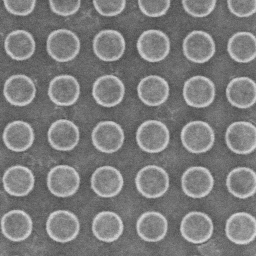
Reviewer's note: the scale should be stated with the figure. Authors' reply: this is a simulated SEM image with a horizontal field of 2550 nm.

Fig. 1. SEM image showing a regular array of raised bodies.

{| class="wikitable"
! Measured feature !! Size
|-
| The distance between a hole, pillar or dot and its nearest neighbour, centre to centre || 444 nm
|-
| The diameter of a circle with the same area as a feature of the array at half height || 296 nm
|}